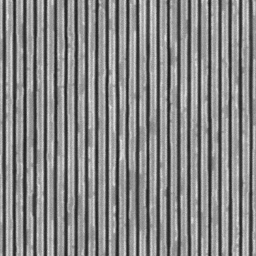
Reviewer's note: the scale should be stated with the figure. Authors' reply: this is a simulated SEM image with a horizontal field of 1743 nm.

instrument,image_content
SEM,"parallel lines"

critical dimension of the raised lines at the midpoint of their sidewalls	42.6	nanometres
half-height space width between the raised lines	24.7	nm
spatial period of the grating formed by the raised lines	69.9	nanometres